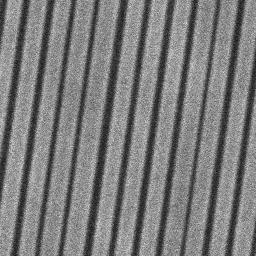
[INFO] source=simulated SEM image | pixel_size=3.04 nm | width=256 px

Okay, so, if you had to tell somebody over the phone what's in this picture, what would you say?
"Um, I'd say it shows parallel lines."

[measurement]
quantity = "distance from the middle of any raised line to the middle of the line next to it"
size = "0.0718 µm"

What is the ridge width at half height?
46.9 nanometres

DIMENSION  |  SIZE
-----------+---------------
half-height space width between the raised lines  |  24.4 nanometers